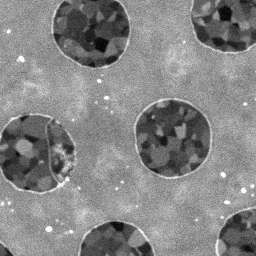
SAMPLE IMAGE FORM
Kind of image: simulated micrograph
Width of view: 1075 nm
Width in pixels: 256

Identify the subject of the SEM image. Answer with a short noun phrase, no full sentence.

raised bodies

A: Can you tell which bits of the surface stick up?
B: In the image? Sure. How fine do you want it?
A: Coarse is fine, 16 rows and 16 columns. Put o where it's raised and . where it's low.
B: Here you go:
....oooo....oooo
...ooooo....oooo
...ooooo....oooo
....oooo........
................
................
..........oo....
.oo......oooo...
ooo.....ooooo...
ooo......oooo...
ooo......ooo....
.ooo............
................
..............oo
......ooo.....oo
.....ooooo....oo